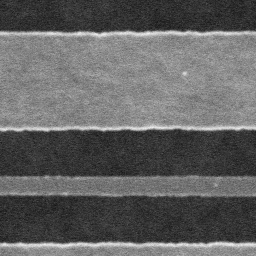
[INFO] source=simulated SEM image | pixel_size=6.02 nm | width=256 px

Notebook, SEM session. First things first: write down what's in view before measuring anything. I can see lines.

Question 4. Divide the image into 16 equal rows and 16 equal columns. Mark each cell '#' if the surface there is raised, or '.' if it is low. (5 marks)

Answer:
................
................
################
################
################
################
################
################
................
................
................
................
................
................
................
################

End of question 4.